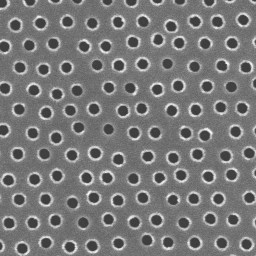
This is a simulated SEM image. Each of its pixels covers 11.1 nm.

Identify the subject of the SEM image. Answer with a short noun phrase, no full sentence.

a regular array of holes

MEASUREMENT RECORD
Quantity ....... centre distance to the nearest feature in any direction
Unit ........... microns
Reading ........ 0.247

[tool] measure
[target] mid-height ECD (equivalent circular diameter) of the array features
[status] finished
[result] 114 nm